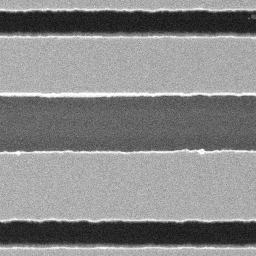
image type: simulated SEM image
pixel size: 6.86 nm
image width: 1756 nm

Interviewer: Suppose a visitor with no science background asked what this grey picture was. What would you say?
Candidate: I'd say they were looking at lines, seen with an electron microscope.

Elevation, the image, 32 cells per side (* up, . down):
********************************
................................
................................
................................
................................
********************************
********************************
********************************
********************************
********************************
********************************
********************************
................................
................................
................................
................................
................................
................................
................................
********************************
********************************
********************************
********************************
********************************
********************************
********************************
********************************
**.***.***.*********************
................................
................................
................................
********************************